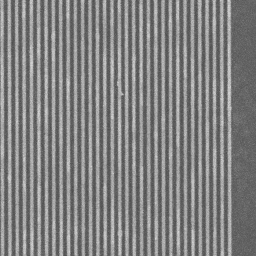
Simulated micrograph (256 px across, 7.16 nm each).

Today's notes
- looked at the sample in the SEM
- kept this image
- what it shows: parallel lines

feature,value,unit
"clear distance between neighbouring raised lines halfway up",33.1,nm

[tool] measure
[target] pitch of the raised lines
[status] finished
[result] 0.0525 µm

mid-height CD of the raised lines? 19.7 nanometers